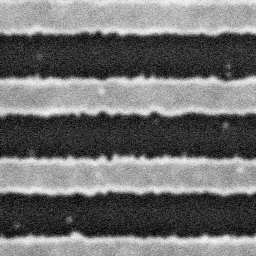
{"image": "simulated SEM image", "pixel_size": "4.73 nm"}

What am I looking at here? lines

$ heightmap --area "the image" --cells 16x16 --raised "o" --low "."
oooooooooooooooo
oooooooooooooooo
................
................
................
oooooooooooooooo
oooooooooooooooo
................
................
................
oooooooooooooooo
oooooooooooooooo
................
................
................
oooooooooooooooo